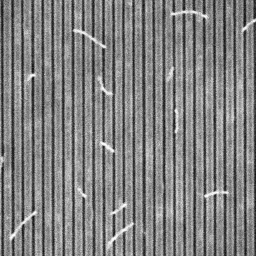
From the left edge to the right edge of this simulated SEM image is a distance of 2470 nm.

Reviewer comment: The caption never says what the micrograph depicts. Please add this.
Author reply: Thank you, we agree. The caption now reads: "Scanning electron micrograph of parallel lines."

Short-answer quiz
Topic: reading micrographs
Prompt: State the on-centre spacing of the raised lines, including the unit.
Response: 0.0974 microns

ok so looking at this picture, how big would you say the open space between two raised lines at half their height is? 27.7 nm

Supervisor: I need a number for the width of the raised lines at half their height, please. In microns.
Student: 0.0651